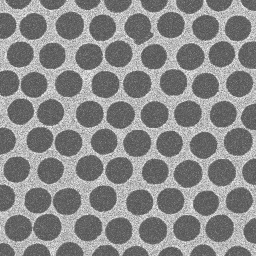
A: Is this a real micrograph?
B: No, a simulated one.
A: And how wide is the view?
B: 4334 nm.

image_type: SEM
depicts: a regular array of holes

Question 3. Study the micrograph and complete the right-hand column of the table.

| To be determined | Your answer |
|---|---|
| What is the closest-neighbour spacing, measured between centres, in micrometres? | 0.528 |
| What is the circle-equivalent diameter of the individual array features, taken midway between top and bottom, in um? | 0.465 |